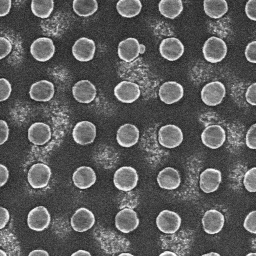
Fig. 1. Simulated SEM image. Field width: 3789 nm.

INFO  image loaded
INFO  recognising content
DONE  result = a regular array of raised bodies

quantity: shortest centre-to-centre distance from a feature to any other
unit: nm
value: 619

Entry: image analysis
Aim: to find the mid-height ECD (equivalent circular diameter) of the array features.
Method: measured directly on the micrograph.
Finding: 0.329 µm